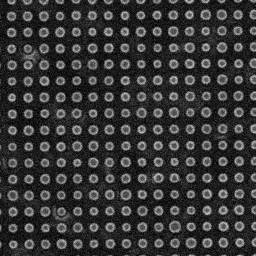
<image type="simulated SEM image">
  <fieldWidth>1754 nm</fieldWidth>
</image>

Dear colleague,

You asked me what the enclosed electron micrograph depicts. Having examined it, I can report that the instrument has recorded a regular array of raised bodies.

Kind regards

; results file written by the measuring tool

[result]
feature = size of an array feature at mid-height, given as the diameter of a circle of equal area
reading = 54.7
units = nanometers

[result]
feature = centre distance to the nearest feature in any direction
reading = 0.109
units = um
